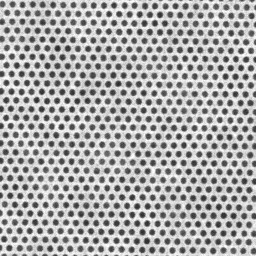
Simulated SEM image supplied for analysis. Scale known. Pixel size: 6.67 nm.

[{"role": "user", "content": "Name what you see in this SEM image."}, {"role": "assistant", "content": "a regular array of holes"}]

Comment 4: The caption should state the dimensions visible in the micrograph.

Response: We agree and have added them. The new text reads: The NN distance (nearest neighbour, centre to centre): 64.5 nm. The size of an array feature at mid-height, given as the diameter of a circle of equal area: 47 nm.